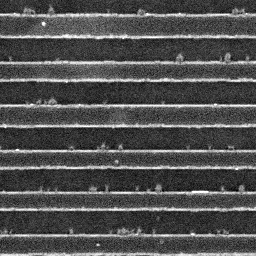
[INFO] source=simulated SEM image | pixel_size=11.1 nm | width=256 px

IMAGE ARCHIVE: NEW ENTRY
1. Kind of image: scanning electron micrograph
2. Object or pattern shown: lines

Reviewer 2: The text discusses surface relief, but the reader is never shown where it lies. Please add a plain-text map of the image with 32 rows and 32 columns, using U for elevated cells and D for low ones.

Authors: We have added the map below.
DDDDDDDDDDDDDDDDDDDDDDDDDDDDDDDD
DDDUDDUDDDDDDDDDDDDDDDDDDDDDDDDD
UUUUUUUUUUUUUUUUUUUUUUUUUUUUUUUU
UUUUUUUUUUUUUUUUUUUUUUUUUUUUUUUU
UUUUUUUUUUUUUUUUUUUUUUUUUUUUUUUU
DDDDDDDDDDDDDDDDDDDDDDDDDDDDDDDD
DDDDDDDDDDDDDDDDDDDDDDDDDDDDDDDD
DDDDDDDDDDDDDDDDDDDDDDUDDDDDUDDD
UUUUUUUUUUUUUUUUUUUUUUUUUUUUUUUU
UUUUUUUUUUUUUUUUUUUUUUUUUUUUUUUU
DDDDDDDDDDDDDDDDDDDDDDDDDDDDDDDD
DDDDDDDDDDDDDDDDDDDDDDDDDDDDDDDD
DDDDDDDDDDDDDDDDDDDDDDDDDDDDDDDD
UUUUUUUUUUUUUUUUUUUUUUUUUUUUUUUU
UUUUUUUUUUUUUUUUUUUUUUUUUUUUUUUU
UUUUUUUUUUUUUUUUUUUUUUUUUUUUUUUU
DDDDDDDDDDDDDDDDDDDDDDDDDDDDDDDD
DDDDDDDDDDDDDDDDDDDDDDDDDDDDDDDD
DDDDDDDDDDDDDDDDDDDDDDDDDDDDDDDD
UUUUUUUUUUUUUUUUUUUUUUUUUUUUUUUU
UUUUUUUUUUUUUUUUUUUUUUUUUUUUUUUU
DDDDDDDDDDDDDDDDDDDDDDDDDDDDDDDD
DDDDDDDDDDDDDDDDDDDDDDDDDDDDDDDD
DDDDDDDDDDDDDDDDDDDDDDDDDDDDDDDD
UUUUUUUUUUUUUUUUUUUUUUUUUUUUUUUU
UUUUUUUUUUUUUUUUUUUUUUUUUUUUUUUU
DDDDDDDDDDDDDDDDDDDDDDDDDDDDDDDD
DDDDDDDDDDDDDDDDDDDDDDDDDDDDDDDD
DDDDDDDDDDDDDDDDDDDDDDDDDDDDDDDD
UDDUUUUUUUUUUUUUUUUUUUUUUUUUDUUU
UUUUUUUUUUUUUUUUUUUUUUUUUUUUUUUU
UUUUUUUUUUUUUUUUUUUUUUUUUUUUUUUU